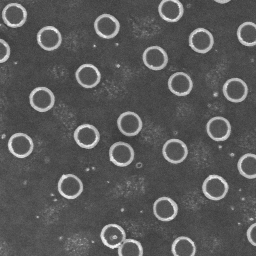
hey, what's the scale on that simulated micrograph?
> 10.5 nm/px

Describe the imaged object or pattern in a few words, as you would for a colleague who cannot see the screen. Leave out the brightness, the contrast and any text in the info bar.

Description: a regular array of raised bodies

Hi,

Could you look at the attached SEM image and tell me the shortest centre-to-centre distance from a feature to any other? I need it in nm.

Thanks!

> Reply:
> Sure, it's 472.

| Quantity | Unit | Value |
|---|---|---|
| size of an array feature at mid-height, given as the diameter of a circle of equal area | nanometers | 236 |